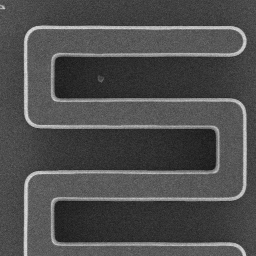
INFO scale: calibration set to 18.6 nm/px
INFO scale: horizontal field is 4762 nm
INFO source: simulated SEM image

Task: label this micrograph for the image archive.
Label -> groups of lines, slits or small figures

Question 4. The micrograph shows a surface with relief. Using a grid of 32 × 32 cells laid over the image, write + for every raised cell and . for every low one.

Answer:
................................
................................
................................
....+++++++++++++++++++++++++...
...+++++++++++++++++++++++++++..
...++++++++++++++++++++++++++++.
...+++++++++++++++++++++++++++..
...++++.........................
...++++.........................
...++++.........................
...++++.........................
...++++.........................
...+++++........................
...+++++++++++++++++++++++++++..
...++++++++++++++++++++++++++++.
....+++++++++++++++++++++++++++.
...........................++++.
...........................++++.
...........................++++.
...........................++++.
...........................++++.
........+++++++++.........+++++.
...++++++++++++++++++++++++++++.
...++++++++++++++++++++++++++++.
...+++++++++++++++++++++++++++..
...++++.........................
...++++.........................
...++++.........................
...++++.........................
...++++.........................
...+++++........................
...+++++++++++++++++++++++++++..